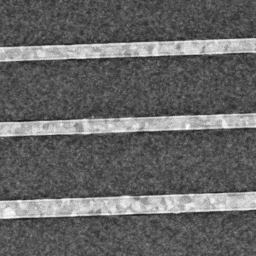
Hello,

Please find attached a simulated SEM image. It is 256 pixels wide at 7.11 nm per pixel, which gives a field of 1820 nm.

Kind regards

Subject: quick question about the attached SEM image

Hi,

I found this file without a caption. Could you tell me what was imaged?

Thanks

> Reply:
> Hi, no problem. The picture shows one or a few lines or trenches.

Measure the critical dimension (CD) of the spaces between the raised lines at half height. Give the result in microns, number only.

0.443